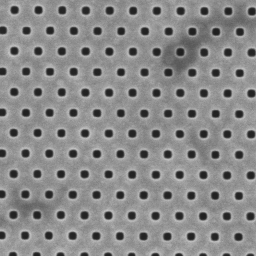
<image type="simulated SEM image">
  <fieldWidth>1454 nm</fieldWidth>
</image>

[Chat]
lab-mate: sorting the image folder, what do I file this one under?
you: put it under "a regular array of holes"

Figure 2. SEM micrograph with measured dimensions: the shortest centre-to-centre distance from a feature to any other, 23.4 px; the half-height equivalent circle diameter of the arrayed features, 48.4 nm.